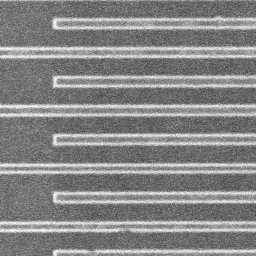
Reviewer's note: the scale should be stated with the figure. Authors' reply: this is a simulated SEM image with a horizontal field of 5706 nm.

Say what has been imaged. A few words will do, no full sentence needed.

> parallel lines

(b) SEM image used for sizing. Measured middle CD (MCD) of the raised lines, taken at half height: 198 nanometers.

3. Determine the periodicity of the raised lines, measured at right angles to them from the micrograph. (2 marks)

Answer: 0.647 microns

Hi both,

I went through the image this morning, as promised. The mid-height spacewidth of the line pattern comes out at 462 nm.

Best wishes